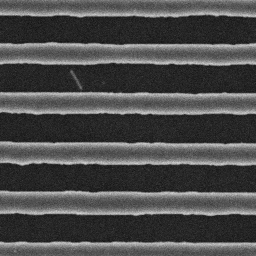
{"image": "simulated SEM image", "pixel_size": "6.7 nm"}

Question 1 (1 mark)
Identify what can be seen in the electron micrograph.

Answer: lines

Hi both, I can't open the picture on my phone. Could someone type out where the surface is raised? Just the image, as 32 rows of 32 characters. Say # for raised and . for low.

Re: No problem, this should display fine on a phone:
################################
################################
................................
................................
................................
.#.#######.....................#
################################
################################
................................
................................
................................
................................
################################
################################
................................
................................
................................
................................
################################
################################
..##...##...####################
................................
................................
................................
################################
################################
################################
................................
................................
................................
########################.#######
################################